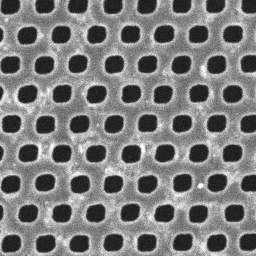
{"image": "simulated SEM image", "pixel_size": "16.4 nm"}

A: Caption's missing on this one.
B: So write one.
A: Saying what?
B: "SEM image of a regular array of holes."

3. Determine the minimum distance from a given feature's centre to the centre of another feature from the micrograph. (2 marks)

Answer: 552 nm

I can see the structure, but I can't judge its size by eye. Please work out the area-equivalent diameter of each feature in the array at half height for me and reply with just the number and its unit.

326 nanometers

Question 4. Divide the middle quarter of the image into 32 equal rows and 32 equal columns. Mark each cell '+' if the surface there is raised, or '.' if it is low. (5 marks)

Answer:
+.....++++.....+++.....++++.....
+....+++++.....++++....++++....+
+++++++++++..+++++++++++++++.+++
++++++++++++++++++++++++++++++++
++++++++++++++++++++++++++++++++
.++++++...++++++..++++++..++++++
..++++.....++++....++++....++++.
..++++.....++++....+++.....++++.
..++++....++++.....+++.....++++.
.+++++....+++++...+++++...++++++
++++++++++++++++++++++++++++++++
++++++++++++++++++++++++++++++++
++++++++++++++++++++++++++++++++
++....+++++....++++....++++.....
++.....+++.....+++.....++++.....
+.....++++.....+++.....++++.....
++....++++.....++++....++++....+
+++++++++++..+++++++++++++++++++
++++++++++++++++++++++++++++++++
++++++++++++++++++++++++++++++++
.++++++...++++++...+++++...+++++
..++++.....++++....++++.....+++.
..+++......+++.....++++.....+++.
..+++.....++++.....++++....++++.
.+++++...++++++....+++++..++++++
++++++++++++++++++++++++++++++++
++++++++++++++++++++++++++++++++
++++++++++++++++++++++++++++++.+
++....++++.....++++....++++.....
++.....+++.....+++......+++.....
+......+++.....+++.....++++.....
++....++++....+++++....+++++...+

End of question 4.